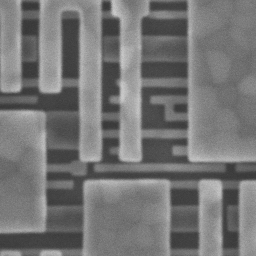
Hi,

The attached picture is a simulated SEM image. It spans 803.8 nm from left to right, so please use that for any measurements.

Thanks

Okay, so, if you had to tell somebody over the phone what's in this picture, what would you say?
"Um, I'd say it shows wiring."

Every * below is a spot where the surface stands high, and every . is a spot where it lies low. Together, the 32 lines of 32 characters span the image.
***..********.*****.....********
***..***..***.*****.....********
***..***..***..***......********
***..***..***..***......********
***..***..***..***......********
***..***..***..***......********
***..***..***..***......********
***..***..***..***......********
***..***..***..**.......********
***..***..***..**.......********
***..***..***..**.......********
**...**...***..**.......********
..........***..**.......********
..........***..**.......********
******....***..**.......********
******....***..**.......********
******....***..**.......********
******....***..***......********
******....***..***......********
******....***..***......********
******..........................
******..........................
******..........................
******....***********....***..**
******....***********....***..**
******....***********....***..**
******.....**********....***..**
******....***********....***..**
******....***********....***..**
..........***********....***..**
..........***********....***..**
**...**...***********....***..**